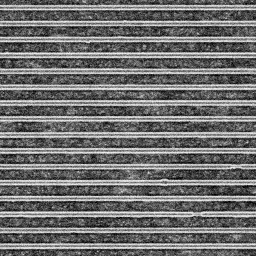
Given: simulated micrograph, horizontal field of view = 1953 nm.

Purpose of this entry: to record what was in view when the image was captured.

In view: parallel lines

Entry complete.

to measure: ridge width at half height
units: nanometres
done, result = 32.4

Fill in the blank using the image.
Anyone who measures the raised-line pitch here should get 122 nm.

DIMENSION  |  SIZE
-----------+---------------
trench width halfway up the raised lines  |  11.8 pixels